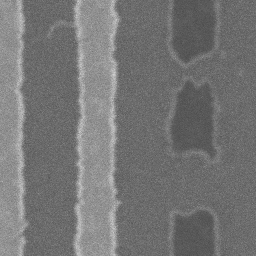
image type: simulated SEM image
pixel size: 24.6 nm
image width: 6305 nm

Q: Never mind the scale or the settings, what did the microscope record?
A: one or a few lines or trenches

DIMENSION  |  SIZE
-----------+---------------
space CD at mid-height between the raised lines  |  1430 nm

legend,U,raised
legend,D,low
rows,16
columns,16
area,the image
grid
UDDDDUUDDDDUUUDD
UDDDDUUDDDDUUUDD
UDDDDUUDDDDUUUDD
UDDDDUUDDDDUUDDD
UDDDDUUDDDDDDDDD
UDDDDUUDDDDUUDDD
UDDDDUUDDDDUUDDD
UDDDDUUDDDDUUDDD
UDDDDUUDDDDUUDDD
UDDDDUUDDDDUUUDD
UDDDDUUDDDDDDDDD
UDDDDUUDDDDDDDDD
UDDDDUUDDDDDDDDD
UDDDDUUDDDDUUDDD
UDDDDUUDDDDUUUDD
UDDDDUUDDDDUUUDD